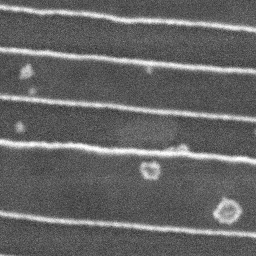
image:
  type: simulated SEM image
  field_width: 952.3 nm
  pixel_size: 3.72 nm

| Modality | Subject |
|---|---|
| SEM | lines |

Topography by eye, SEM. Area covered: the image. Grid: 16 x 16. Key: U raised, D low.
UUUUUUUUUUUUUUUU
DDDDDDDDDDDUUUUU
DDDDDDDDDDDDDDDD
UUUUUDDDDDDDDDDD
UUUUUUUUUUUUUUUU
UUUUUUUUUUUUUUUU
DDDDUUUUUUUUUUUU
DDDDDDDDDDDDDDDU
DDDDDDDDDDDDDDDD
UUUUUUUUUUDDDDDD
UUUUUUUUUUUUUUUU
UUUUUUUUUUUUUUUU
UUUUUUUUUUUUUUUU
DUUUUUUUUUUUUUUU
DDDDDDDDDDDDUUUU
DDDDDDDDDDDDDDDD